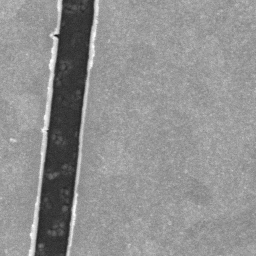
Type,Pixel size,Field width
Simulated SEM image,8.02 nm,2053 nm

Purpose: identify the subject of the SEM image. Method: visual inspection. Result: one or a few lines or trenches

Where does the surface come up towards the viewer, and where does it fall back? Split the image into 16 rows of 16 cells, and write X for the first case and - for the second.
XXXX--XXXXXXXXXX
XXXX--XXXXXXXXXX
XXX---XXXXXXXXXX
XXX---XXXXXXXXXX
XXX---XXXXXXXXXX
XXX--XXXXXXXXXXX
XXX--XXXXXXXXXXX
XXX--XXXXXXXXXXX
XXX--XXXXXXXXXXX
XXX--XXXXXXXXXXX
XXX--XXXXXXXXXXX
XXX--XXXXXXXXXXX
XX---XXXXXXXXXXX
XX---XXXXXXXXXXX
XX--XXXXXXXXXXXX
XX--XXXXXXXXXXXX